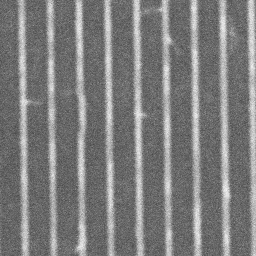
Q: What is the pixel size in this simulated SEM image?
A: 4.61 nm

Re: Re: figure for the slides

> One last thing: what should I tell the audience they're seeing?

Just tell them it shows parallel lines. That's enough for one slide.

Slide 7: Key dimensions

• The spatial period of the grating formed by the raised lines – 132 nanometres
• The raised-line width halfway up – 0.0236 micrometres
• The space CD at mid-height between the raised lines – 0.111 µm